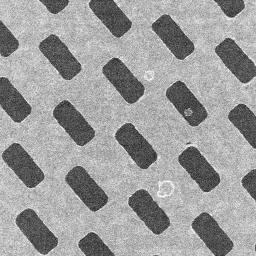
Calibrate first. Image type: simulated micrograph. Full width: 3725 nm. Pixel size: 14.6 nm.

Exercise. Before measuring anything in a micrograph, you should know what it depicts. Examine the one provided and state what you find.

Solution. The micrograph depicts a regular array of holes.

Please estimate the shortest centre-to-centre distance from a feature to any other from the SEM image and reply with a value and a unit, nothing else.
0.957 um